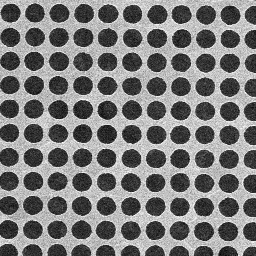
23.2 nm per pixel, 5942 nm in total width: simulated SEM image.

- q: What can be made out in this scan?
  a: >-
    a regular array of holes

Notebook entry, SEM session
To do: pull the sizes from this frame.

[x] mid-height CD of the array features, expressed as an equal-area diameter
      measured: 460 nm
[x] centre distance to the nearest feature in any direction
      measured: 554 nm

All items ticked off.